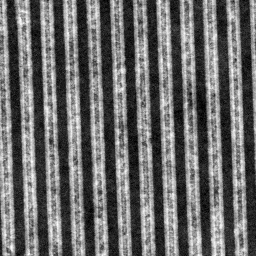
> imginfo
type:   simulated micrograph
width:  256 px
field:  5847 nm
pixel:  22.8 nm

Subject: parallel lines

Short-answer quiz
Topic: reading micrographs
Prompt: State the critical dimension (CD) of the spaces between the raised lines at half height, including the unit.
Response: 331 nm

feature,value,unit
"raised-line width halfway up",0.197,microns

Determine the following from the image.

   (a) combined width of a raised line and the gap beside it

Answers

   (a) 531 nm